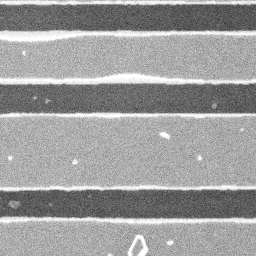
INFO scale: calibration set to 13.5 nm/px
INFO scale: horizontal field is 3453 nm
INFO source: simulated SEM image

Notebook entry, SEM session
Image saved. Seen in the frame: lines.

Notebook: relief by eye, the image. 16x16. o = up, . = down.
................
................
oooooooooooooooo
oooooooooooooooo
oooooooooooooooo
................
................
oooooooooooooooo
oooooooooooooooo
oooooooooooooooo
oooooooooooooooo
oooooooooooooooo
................
................
oooooooooooooooo
oooooooooooooooo